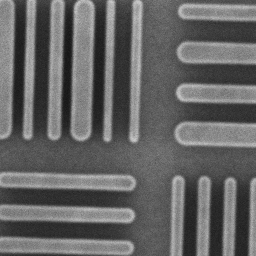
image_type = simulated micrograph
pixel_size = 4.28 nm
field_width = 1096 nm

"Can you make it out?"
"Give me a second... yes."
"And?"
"groups of lines, slits or small figures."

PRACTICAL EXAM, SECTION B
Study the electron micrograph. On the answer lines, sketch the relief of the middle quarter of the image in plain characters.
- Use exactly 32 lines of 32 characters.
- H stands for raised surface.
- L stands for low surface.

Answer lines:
LLHHHHHLLLHHLLLLLHHLLLLLLLLLLLLL
LLHHHHHLLLHHLLLLLHHLLLLLLLLLLLLL
LLHHHHHLLLHHLLLLLHHLLLLLLLLLLLLL
LLHHHHHLLLHHLLLLLHHLLLLLLLLLLLLL
LLHHHHHLLLHHLLLLLHHLLLLLLLLLLLLL
LLHHHHHLLLHHLLLLLHHLLLLLLLLLLHHH
LLHHHHHLLLHHLLLLLHHLLLLLLLLLHHHH
LLHHHHHLLLHHLLLLLHHLLLLLLLLLHHHH
LLHHHHHLLLHHLLLLLHHLLLLLLLLLLHHH
LLHHHHHLLLHHLLLLLHHLLLLLLLLLLLLL
LLHHHHHLLLHHLLLLLHHLLLLLLLLLLLLL
LLHHHHHLLLHHLLLLLHHLLLLLLLLLLLLL
LLHHHHHLLLHHLLLLLHLLLLLLLLLLLLLL
LLHHHHHLLLHHLLLLLHLLLLLLLLLLLLLL
LLHHHHHLLLHHLLLLLHLLLLLLLLLLLLLL
LLHHHHHLLLHHLLLLLHLLLLLLLLLLLHHH
LLHHHHHLLLHHLLLLLHLLLLLLLLLLHHHH
LLHHHHHLLLHHLLLLHHLLLLLLLLLLHHHH
LLLHHHLLLLHHLLLLHHLLLLLLLLLLHHHH
LLLLLLLLLLLLLLLLLLLLLLLLLLLLLHHH
LLLLLLLLLLLLLLLLLLLLLLLLLLLLLLLL
LLLLLLLLLLLLLLLLLLLLLLLLLLLLLLLL
LLLLLLLLLLLLLLLLLLLLLLLLLLLLLLLL
LLLLLLLLLLLLLLLLLLLLLLLLLLLLLLLL
LLLLLLLLLLLLLLLLLLLLLLLLLLLLLLLL
LLLLLLLLLLLLLLLLLLLLLLLLLLLLLLLL
LLLLLLLLLLLLLLLLLLLLLLLLLLLLLLLL
LLLLLLLLLLLLLLLLLLLLLLLLLLLLLLLL
HHHHHHHHHHHHHHHHHLLLLLLLLLLLHHLL
HHHHHHHHHHHHHHHHHHLLLLLLLLLHHHLL
HHHHHHHHHHHHHHHHHHLLLLLLLLLHHHLL
LLLLLLLLLLLLLHHHHLLLLLLLLLLHHHLL